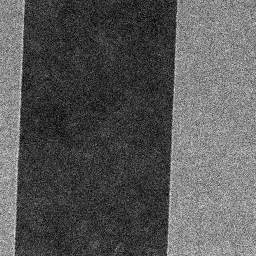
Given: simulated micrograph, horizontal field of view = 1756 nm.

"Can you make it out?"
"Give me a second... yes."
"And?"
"one or a few lines or trenches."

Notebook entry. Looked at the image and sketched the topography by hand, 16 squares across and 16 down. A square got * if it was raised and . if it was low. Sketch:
*..........*****
*..........*****
*..........*****
*..........*****
*..........*****
*..........*****
*..........*****
*..........*****
*..........*****
*..........*****
*..........*****
*..........*****
*..........*****
*..........*****
*..........*****
*..........*****